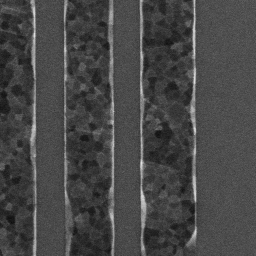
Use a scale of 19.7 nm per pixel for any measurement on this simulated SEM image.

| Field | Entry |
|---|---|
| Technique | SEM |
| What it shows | wiring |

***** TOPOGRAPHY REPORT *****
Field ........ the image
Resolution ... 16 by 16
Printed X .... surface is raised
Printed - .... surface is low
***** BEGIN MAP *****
XX--XXX--XXX----
XX--XXX--XXX----
XX--XXX--XXX----
XX--XXX--XXX----
XX--XXX--XXX----
XX--XXX--XXX----
XX--XXX--XXX----
XX--XXX--XXX----
XX--XXX--XXX----
XX--XXX--XXX----
XX--XXX--XXX----
XX--XXX--XXX----
XX--XXX--XXX----
XX--XXX--XXX----
XX--XXX--XXX----
XX--XXX--XXX----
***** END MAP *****